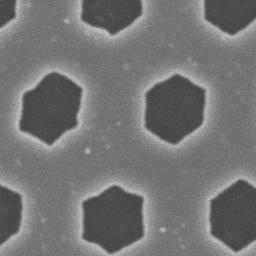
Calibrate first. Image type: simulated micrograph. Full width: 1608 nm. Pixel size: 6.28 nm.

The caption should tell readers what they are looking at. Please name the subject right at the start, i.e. holes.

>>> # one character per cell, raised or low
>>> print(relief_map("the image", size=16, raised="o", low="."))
.oooo....oooo...
ooooo...ooooo...
oooooooooooooooo
oooooooooooooooo
oooooooooooooooo
oo...oooo....ooo
o....oooo....ooo
o....oooo....ooo
oo..oooooo..oooo
oooooooooooooooo
oooooooooooooooo
ooooooooooooooo.
.oooo....oooo...
.oooo....oooo...
.oooo....oooo...
oooooo..oooooo.o